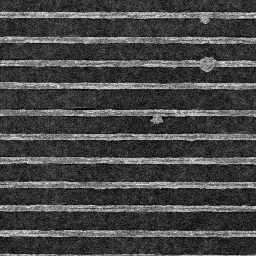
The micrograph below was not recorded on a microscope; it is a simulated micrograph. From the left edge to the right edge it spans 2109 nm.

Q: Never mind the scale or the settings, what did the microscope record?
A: parallel lines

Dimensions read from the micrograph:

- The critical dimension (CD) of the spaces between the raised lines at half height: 149 nanometers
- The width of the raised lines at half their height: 0.0484 µm